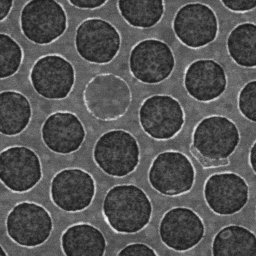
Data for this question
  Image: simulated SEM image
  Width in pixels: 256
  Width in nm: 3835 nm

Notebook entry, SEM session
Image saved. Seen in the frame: a regular array of holes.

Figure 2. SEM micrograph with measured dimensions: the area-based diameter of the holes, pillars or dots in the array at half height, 667 nm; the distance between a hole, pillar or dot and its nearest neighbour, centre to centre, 841 nanometers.